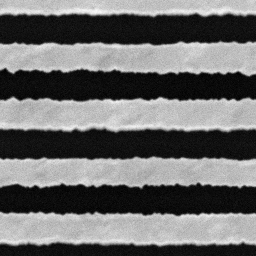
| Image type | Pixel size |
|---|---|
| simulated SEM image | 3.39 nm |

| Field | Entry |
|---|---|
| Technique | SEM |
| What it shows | lines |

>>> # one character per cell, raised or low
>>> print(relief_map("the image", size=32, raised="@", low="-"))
@@@@@@@@@@@@@@@@@@@@@@@@@@@@@@@@
@@@@@@@@@@@@@@@@@@@@@@@@@@@@@@@@
--------------------------------
--------------------------------
--------------------------------
------@-----@---------@@@@@@@@-@
@@@@@@@@@@@@@@@@@@@@@@@@@@@@@@@@
@@@@@@@@@@@@@@@@@@@@@@@@@@@@@@@@
@@@@@@@@@@@@@@@@@@@@@@@@@@@@@@@@
--------------------------------
--------------------------------
--------------------------------
-@-@@@@------@-@@@-@@@--@@@@@-@@
@@@@@@@@@@@@@@@@@@@@@@@@@@@@@@@@
@@@@@@@@@@@@@@@@@@@@@@@@@@@@@@@@
@@@@@@@@@@@@@@@@@@@@@@@@@@@@@@@@
--------------------------------
--------------------------------
--------------------------------
--------------------------------
@@@@@@@@@@@@@@@@@@@@@@@@@@@@@@@@
@@@@@@@@@@@@@@@@@@@@@@@@@@@@@@@@
@@@@@@@@@@@@@@@@@@@@@@@@@@@@@@@@
--------------------------------
--------------------------------
--------------------------------
--------------------------------
@@@@@@@@@@@@@@@@@@@@@@@@@@@@@@@@
@@@@@@@@@@@@@@@@@@@@@@@@@@@@@@@@
@@@@@@@@@@@@@@@@@@@@@@@@@@@@@@@@
-@---------------@@@@----@-@----
--------------------------------